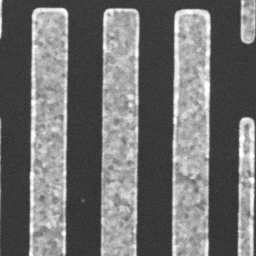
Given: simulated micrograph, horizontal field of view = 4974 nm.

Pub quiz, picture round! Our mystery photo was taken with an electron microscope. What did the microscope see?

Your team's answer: wiring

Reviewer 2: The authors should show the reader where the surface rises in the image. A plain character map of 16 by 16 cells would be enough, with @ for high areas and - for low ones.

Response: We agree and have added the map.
---------------@
--@@---@@--@@--@
--@@---@@--@@--@
--@@---@@--@@---
--@@--@@@--@@---
--@@--@@@--@@---
--@@--@@@--@@---
--@@--@@@--@@---
--@@--@@@--@@--@
--@@--@@@--@@--@
--@@--@@@--@@--@
--@@--@@@--@@--@
--@@--@@---@@--@
--@@--@@---@@--@
--@@--@@---@@--@
--@@--@@---@@--@